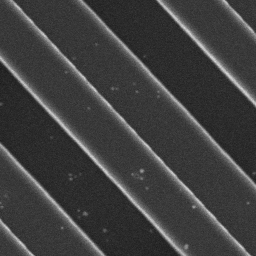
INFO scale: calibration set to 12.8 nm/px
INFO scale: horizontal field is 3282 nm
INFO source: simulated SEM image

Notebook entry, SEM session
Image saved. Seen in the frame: lines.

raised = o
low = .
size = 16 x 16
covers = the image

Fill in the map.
oooooo....oooooo
oooooo.....ooooo
ooooooo.....oooo
oooooooo.....ooo
.oooooooo.....oo
..oooooooo.....o
...oooooooo.....
....oooooooo....
.....oooooooo...
.....ooooooooo..
o.....ooooooooo.
oo.....ooooooooo
ooo.....oooooooo
oooo.....ooooooo
ooooo.....oooooo
oooooo.....ooooo